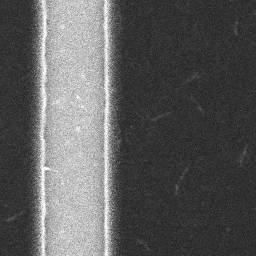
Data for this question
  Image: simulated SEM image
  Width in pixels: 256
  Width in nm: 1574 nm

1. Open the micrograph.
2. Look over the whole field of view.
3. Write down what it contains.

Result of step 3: one or a few lines or trenches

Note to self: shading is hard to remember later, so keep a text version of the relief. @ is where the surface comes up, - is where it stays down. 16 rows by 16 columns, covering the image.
@@@----@@@@@@@@@
@@@----@@@@@@@@@
@@@----@@@@@@@@@
@@@----@@@@@@@@@
@@@----@@@@@@@@@
@@@----@@@@@@@@@
@@@----@@@@@@@@@
@@@----@@@@@@@@@
@@@----@@@@@@@@@
@@@----@@@@@@@@@
@@@----@@@@@@@@@
@@@----@@@@@@@@@
@@@----@@@@@@@@@
@@@----@@@@@@@@@
@@@----@@@@@@@@@
@@@----@@@@@@@@@